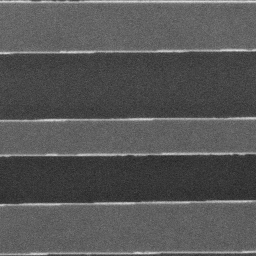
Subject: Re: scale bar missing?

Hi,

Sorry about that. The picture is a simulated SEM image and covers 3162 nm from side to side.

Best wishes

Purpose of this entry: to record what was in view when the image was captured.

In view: lines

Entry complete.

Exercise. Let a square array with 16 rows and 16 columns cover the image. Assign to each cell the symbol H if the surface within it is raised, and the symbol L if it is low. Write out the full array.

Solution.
HHHHHHHHHHHHHHHH
HHHHHHHHHHHHHHHH
HHHHHHHHHHHHHHHH
LLLLLLLLLLLLLLLL
LLLLLLLLLLLLLLLL
LLLLLLLLLLLLLLLL
LLLLLLLLLLLLLLLL
LLLHHHHHHHHHHHHH
HHHHHHHHHHHHHHHH
HHHHHHHHHHHHHHHH
LLLLLLLLLLLLLLLL
LLLLLLLLLLLLLLLL
LLLLLLLLLLLLLLLL
HHHHHHHHHHHHHHHH
HHHHHHHHHHHHHHHH
HHHHHHHHHHHHHHHH